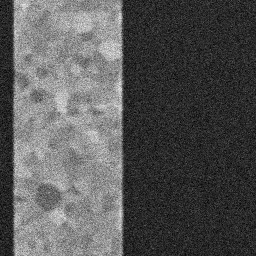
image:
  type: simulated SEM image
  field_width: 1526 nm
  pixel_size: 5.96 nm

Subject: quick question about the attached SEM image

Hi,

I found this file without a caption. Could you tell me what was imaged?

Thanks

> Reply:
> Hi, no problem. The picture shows one or a few lines or trenches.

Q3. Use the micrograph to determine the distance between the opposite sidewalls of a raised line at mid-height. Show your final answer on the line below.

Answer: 633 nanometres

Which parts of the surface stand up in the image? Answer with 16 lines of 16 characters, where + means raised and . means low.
.++++++.........
.+++++++........
.+++++++........
.+++++++........
.+++++++........
.+++++++........
.+++++++........
.+++++++........
.+++++++........
.+++++++........
.+++++++........
.+++++++........
.+++++++........
.+++++++........
.+++++++........
.+++++++........